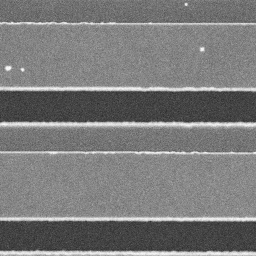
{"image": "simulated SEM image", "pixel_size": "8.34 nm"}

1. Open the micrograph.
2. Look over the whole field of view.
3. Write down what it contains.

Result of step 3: lines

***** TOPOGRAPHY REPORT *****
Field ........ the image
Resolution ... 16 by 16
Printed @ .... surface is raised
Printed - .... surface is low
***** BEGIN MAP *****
@@@@@@@@@@@@@@@@
@@@@@@@@@@@@@@@@
@@@@@@@@@@@@@@@@
@@@@@@@@@@@@@@@@
@@@@@@@@@@@@@@@@
@@@@@@@@@@@@@@@@
----------------
----------------
@@@@@@@@@@@@@@@@
@@@@@@@@@@@@@@@@
@@@@@@@@@@@@@@@@
@@@@@@@@@@@@@@@@
@@@@@@@@@@@@@@@@
@@@@@@@@@@@@@@@@
----------------
----------------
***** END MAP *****